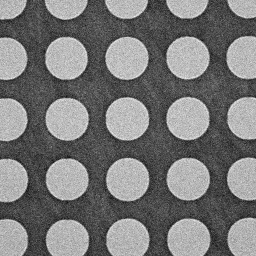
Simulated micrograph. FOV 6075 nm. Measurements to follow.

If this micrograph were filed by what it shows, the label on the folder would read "an array of small figures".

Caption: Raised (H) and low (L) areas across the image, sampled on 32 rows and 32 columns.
HHHLLLHHHHHLLHHHHHLLLHHHHHLLLHHH
HHHLLLHHHHLLLLHHHHLLLLHHHLLLLHHH
LLLLLLLLLLLLLLLLLLLLLLLLLLLLLLLL
LLLLLLLLLLLLLLLLLLLLLLLLLLLLLLLL
LLLLLLLLLLLLLLLLLLLLLLLLLLLLLLLL
HHHLLLHHHHLLLLHHHHLLLLHHHLLLLHHH
HHHLLLHHHHHLLHHHHHLLLHHHHHLLHHHH
HHHLLLHHHHHLLHHHHHLLLHHHHHLLHHHH
HHHLLLHHHHHLLLHHHHLLLHHHHHLLLHHH
HHLLLLLHHHLLLLHHHLLLLLHHHLLLLLHH
LLLLLLLLLLLLLLLLLLLLLLLLLLLLLLLL
LLLLLLLLLLLLLLLLLLLLLLLLLLLLLLLL
HHLLLLLHHLLLLLLHHLLLLLHHHLLLLLHH
HHHLLLHHHHHLLLHHHHLLLHHHHHLLLHHH
HHHLLLHHHHHLLHHHHHHLLHHHHHLLLHHH
HHHLLLHHHHHLLHHHHHHLLHHHHHLLLHHH
HHHLLLHHHHLLLLHHHHLLLLHHHHLLLHHH
HLLLLLLLLLLLLLLLLLLLLLLLLLLLLLLL
LLLLLLLLLLLLLLLLLLLLLLLLLLLLLLLL
LLLLLLLLLLLLLLLLLLLLLLLLLLLLLLLL
HHLLLLLHHHLLLLHHHHLLLLHHHLLLLHHH
HHHLLLHHHHHLLLHHHHLLLHHHHHLLLHHH
HHHLLLHHHHHLLHHHHHHLLHHHHHLLHHHH
HHHLLLHHHHHLLLHHHHLLLHHHHHLLLHHH
HHHLLLLHHHLLLLHHHHLLLLHHHLLLLLHH
LLLLLLLLLLLLLLLLLLLLLLLLLLLLLLLL
LLLLLLLLLLLLLLLLLLLLLLLLLLLLLLLL
HLLLLLLLLLLLLLLHHLLLLLLHLLLLLLHH
HHHLLLHHHHHLLLHHHHLLLHHHHHLLLHHH
HHHLLLHHHHHLLHHHHHHLLHHHHHLLLHHH
HHHLLLHHHHHLLHHHHHHLLHHHHHLLLHHH
HHHLLLHHHHHLLLHHHHLLLHHHHHLLLHHH